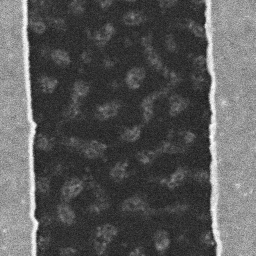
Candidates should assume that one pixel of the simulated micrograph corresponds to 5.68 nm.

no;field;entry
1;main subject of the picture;one or a few lines or trenches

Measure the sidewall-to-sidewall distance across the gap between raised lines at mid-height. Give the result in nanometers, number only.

1030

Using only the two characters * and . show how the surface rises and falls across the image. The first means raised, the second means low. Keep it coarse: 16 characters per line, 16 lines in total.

**...........***
**...........***
**...........***
**...........***
**...........***
**...........***
**...........***
**...........***
**...........***
**...........***
**...........***
**...........***
**...........***
**...........***
**...........***
**............**